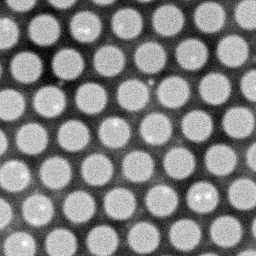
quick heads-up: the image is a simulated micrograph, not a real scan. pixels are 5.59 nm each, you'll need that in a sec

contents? an array of small figures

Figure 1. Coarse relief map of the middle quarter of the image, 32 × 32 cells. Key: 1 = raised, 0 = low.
11111000111111100001111110000011
11110000111111000001111100000000
11110000001110000000000000000000
11000000000000000000000000110000
00000000000000011110000001111100
00000111100000111111000011111110
00001111110000111111100011111110
00011111110000111111100011111110
00011111110000111111100011111110
00011111110000111111000001111100
00001111110000011111000000111000
00001111100000000000000000000000
00000000000000000000000000000001
00000000000000000000011110000011
01110000001111100000111111000011
11111000011111110001111111100011
11111100011111110001111111100011
11111100011111110001111111000011
11111100011111110000111111000001
11111100001111110000011110000000
11111000000111000000000000000000
01100000000000000000000000011100
00000000000000000111000000111111
00000011110000001111100001111111
00000111111000011111110001111111
10000111111100011111110001111111
10000111111100011111110000111111
10000111111100011111110000111110
10000111111000001111100000000000
10000011110000000000000000000000
00000000000000000000000000000000
00000000000001100000001111100000